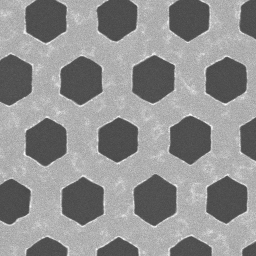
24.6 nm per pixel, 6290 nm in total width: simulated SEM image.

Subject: a regular array of holes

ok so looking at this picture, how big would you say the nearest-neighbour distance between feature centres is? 1720 nm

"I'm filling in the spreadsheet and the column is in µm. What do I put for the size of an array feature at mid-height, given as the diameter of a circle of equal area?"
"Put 1.09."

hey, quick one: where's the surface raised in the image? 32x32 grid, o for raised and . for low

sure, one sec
oooo....ooooo....ooooo....oooo..
ooo.....oooo.....oooo.....oooo..
ooo.....oooo.....oooo.....oooo..
ooo.....oooo.....oooo.....oooo..
oooo...oooooo...oooooo...oooooo.
oooooooooooooooooooooooooooooooo
oooooooooooooooooooooooooooooooo
...oooooo..ooooooo...ooooooo.ooo
....oooo.....oooo.....oooo.....o
....oooo.....ooo......oooo.....o
....oooo.....ooo......oooo.....o
....oooo.....oooo....ooooo.....o
..ooooooo..ooooooo..ooooooo..ooo
oooooooooooooooooooooooooooooooo
oooooooooooooooooooooooooooooooo
ooooo...ooooo....ooooo....ooooo.
ooo.....oooo.....oooo.....oooo..
ooo.....oooo.....oooo.....oooo..
ooo.....oooo.....oooo.....oooo..
ooo.....ooooo...oooooo...oooooo.
ooooo.oooooooooooooooooooooooooo
oooooooooooooooooooooooooooooooo
o.oooooooo.ooooooo...oooooo..ooo
...ooooo.....oooo.....oooo.....o
....oooo.....oooo.....oooo.....o
....oooo.....oooo.....oooo.....o
....oooo.....oooo.....oooo.....o
..ooooooo...oooooo...oooooo..ooo
oooooooooooooooooooooooooooooooo
oooooooooooooooooooooooooooooooo
oooo....ooooo...oooooo....ooooo.
ooo.....oooo.....oooo......ooo..